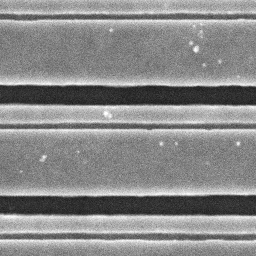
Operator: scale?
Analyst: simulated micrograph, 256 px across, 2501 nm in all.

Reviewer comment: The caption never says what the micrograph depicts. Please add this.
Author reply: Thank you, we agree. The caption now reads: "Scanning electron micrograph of lines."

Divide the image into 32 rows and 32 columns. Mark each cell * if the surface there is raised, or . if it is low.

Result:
********************************
********************************
********************************
********************************
********************************
********************************
********************************
********************************
********************************
********************************
********************************
................................
................................
********************************
********************************
********************************
********************************
********************************
********************************
********************************
********************************
********************************
********************************
********************************
................................
................................
................................
********************************
********************************
********************************
********************************
********************************